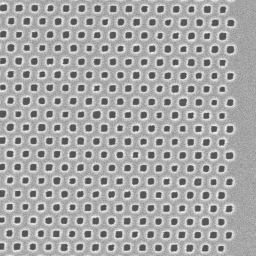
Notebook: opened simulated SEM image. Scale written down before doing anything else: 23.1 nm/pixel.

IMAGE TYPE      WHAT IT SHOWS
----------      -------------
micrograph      a regular array of holes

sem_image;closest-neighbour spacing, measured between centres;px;15.2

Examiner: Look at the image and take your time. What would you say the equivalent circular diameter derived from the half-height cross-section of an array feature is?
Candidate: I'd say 175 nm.